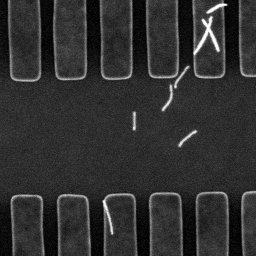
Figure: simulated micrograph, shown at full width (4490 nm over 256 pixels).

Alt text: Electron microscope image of groups of lines, slits or small figures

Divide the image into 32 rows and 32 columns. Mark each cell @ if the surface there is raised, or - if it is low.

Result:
-@@@@--@@@@--@@@@-@@@@--@@@@--@@
-@@@@--@@@@--@@@@-@@@@--@@@@--@@
-@@@@--@@@@--@@@@-@@@@--@@@@--@@
-@@@@--@@@@--@@@@-@@@@--@@@@--@@
-@@@@--@@@@--@@@@-@@@@--@@@@--@@
-@@@@--@@@@--@@@@-@@@@--@@@@--@@
-@@@@--@@@@--@@@@-@@@@--@@@@--@@
-@@@@--@@@@--@@@@--@@@--@@@@--@@
-@@@@--@@@@--@@@@--@@@--@@@@--@@
-@@@@--@@@@--@@@---@@@---@@@----
--------------------------------
--------------------------------
--------------------------------
--------------------------------
--------------------------------
--------------------------------
--------------------------------
--------------------------------
--------------------------------
--------------------------------
--------------------------------
--------------------------------
--------------------------------
--------------------------------
--@@@---@@---@@@@--@@@---@@@--@@
-@@@@--@@@@--@@@@--@@@@--@@@@-@@
-@@@@--@@@@--@@@@--@@@@--@@@@-@@
-@@@@--@@@@--@@@@--@@@@--@@@@-@@
--@@@--@@@@--@@@@--@@@@--@@@@-@@
--@@@--@@@@--@@@@--@@@@--@@@@-@@
--@@@--@@@@--@@@@--@@@@--@@@@-@@
--@@@--@@@@--@@@@--@@@@--@@@@-@@